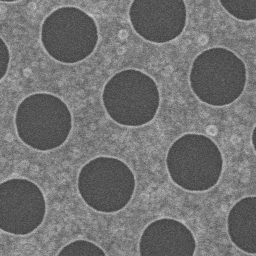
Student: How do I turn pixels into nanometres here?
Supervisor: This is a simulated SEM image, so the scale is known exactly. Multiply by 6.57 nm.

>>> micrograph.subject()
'holes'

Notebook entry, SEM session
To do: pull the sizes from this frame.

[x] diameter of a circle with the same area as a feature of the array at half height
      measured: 376 nanometres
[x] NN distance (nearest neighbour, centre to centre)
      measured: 584 nanometers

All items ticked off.